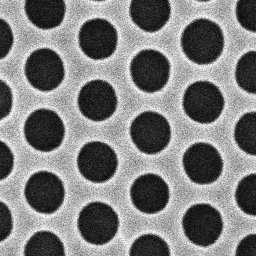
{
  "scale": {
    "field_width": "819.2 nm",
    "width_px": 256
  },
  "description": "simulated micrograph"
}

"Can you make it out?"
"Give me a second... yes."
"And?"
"a regular array of holes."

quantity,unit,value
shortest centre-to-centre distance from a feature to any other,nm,194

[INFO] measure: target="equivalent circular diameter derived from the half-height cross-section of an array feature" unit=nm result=136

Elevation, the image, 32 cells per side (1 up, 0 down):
11100000111111110000011111111100
11100000111111110000011111111000
01110000111001110000011100111100
01111001110000111000111000001100
00111111110000011111111000001111
00111111110000011111111000001111
01110001110000111000111000001110
11100000111101110000011100011100
11100000111111110000011111111000
11100000111111110000011111111000
01110000111000111000011100011100
01111111110000111100111000001110
00111111110000011111111000001111
01111111110000011111111000001111
01110001110000111000111000011100
11100000111111110000011111111000
11100000111111110000011111111000
11100000111111110000011111111000
01110001110000111000011100011100
00111111110000011111111000001111
00111111110000011111111000001111
01111011110000111111111000001111
11100000111000111000111100011100
11100000111111110000011111111100
11100000111111110000011111111000
01110000111001111000011110111100
01111001110000111100111000011100
00111111110000011111111000001111
00111111110000011111111000001111
01110001110000111000111000001110
11100000111001110000011100011100
11100000111111110000011111111000